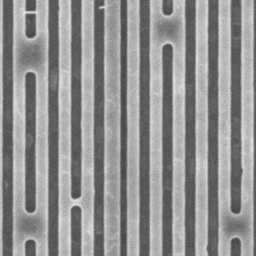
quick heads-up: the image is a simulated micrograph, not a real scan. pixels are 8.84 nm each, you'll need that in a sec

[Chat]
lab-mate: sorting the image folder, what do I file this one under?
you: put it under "parallel lines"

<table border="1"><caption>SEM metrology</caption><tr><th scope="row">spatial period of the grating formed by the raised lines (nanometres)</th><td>202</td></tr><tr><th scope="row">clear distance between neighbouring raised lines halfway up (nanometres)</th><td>95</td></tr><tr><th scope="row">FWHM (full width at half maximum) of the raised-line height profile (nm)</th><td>103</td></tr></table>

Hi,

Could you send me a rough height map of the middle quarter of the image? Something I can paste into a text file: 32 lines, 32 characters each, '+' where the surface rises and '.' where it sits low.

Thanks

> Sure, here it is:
++...++...++++..+++...++...+++..
++...++...++++..+++...++...+++..
++...++...++++..+++...++...+++..
++...++...++++..+++...++...+++..
++...++...++++..+++...++...+++..
++...++...++++..+++...++...+++..
++...++...++++..+++...++...+++..
++...++...++++..+++...++...+++..
++...++...++++..+++...++...+++..
++...++...++++..+++...++...+++..
++...++...++++..+++...++...+++..
++...++...++++..+++...++...+++..
++...++...++++..+++...++...+++..
++...++...++++..+++...++...+++..
++...++...++++..+++...++...+++..
++...++...++++..+++...++...+++..
++..+++...++++..+++...++...+++..
++..+++...++++..+++...++...+++..
++..+++...++++..+++...++...+++..
++...++...++++..+++...++...+++..
++...++...++++..+++...++...+++..
++...++...++++..+++...++...+++..
++...++...++++..+++...++...+++..
++..+++...++++..+++...++...+++..
++..+++...++++..+++...++...+++..
++..+++...++++..+++...++...+++..
++..+++...++++..+++...++...+++..
++..+++...++++..+++...++...+++..
++..+++...++++..+++...++...+++..
++..+++...++++..+++...++...+++..
++..+++...++++..+++...++...+++..
++..+++...++++..+++...++...+++..